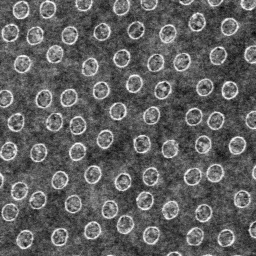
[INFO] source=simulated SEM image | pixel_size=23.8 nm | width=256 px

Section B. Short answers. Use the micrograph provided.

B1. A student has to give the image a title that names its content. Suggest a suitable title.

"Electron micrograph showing a regular array of raised bodies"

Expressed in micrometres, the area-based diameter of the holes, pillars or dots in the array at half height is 0.381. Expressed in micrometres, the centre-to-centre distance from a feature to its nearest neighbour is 0.637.